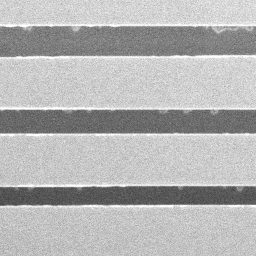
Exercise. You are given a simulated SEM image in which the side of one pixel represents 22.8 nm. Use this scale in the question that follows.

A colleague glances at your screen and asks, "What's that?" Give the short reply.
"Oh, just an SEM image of lines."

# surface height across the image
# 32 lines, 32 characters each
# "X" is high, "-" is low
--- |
XXXXXXXXXXXXXXXXXXXXXXXXXXXXXXXX
XXXXXXXXXXXXXXXXXXXXXXXXXXXXXXXX
XXXXXXXXXXXXXXXXXXXXXXXXXXXXXXXX
--------------------------------
--------------------------------
--------------------------------
--------------------------------
XXXXXXXXXXXXXXXXXXXXXXXXXXXXXXXX
XXXXXXXXXXXXXXXXXXXXXXXXXXXXXXXX
XXXXXXXXXXXXXXXXXXXXXXXXXXXXXXXX
XXXXXXXXXXXXXXXXXXXXXXXXXXXXXXXX
XXXXXXXXXXXXXXXXXXXXXXXXXXXXXXXX
XXXXXXXXXXXXXXXXXXXXXXXXXXXXXXXX
XXXXXXXXXXXXXXXXXXXXXXXXXXXXXXXX
--------------------------------
--------------------------------
--------------------------------
XXXXXXXXXXXXXXXXXXXXXXXXXXXXXXXX
XXXXXXXXXXXXXXXXXXXXXXXXXXXXXXXX
XXXXXXXXXXXXXXXXXXXXXXXXXXXXXXXX
XXXXXXXXXXXXXXXXXXXXXXXXXXXXXXXX
XXXXXXXXXXXXXXXXXXXXXXXXXXXXXXXX
XXXXXXXXXXXXXXXXXXXXXXXXXXXXXXXX
--------------------------------
--------------------------------
--------------------------------
XXXXXXXXXXXXXXXXXXXXXXXXXXXXXXXX
XXXXXXXXXXXXXXXXXXXXXXXXXXXXXXXX
XXXXXXXXXXXXXXXXXXXXXXXXXXXXXXXX
XXXXXXXXXXXXXXXXXXXXXXXXXXXXXXXX
XXXXXXXXXXXXXXXXXXXXXXXXXXXXXXXX
XXXXXXXXXXXXXXXXXXXXXXXXXXXXXXXX